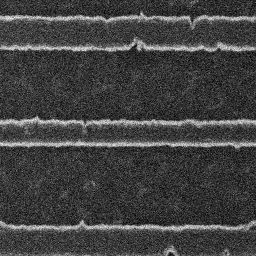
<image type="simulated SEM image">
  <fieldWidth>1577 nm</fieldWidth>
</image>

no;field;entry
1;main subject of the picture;one or a few lines or trenches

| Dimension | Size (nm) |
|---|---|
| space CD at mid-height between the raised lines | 476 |